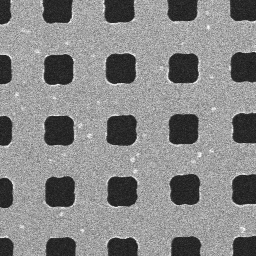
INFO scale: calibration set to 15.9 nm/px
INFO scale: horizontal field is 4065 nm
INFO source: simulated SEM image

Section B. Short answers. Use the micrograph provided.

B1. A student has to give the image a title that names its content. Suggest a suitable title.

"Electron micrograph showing a regular array of holes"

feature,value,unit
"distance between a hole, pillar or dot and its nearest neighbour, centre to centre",970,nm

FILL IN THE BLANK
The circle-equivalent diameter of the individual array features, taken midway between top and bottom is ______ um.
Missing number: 0.516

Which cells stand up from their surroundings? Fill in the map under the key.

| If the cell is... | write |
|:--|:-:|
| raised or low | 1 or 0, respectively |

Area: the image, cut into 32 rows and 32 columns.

01111000011110000111100001111000
01111000011110000111100001111000
01111100011110001111100011111000
11111111111111111111111111111111
11111111111111111111111111111111
11111111111111111111111111111111
11111111111111111111111111111111
01111100011110000111100001111000
01111100011110000111100001111000
00111000011110000111100001111000
11111100111111111111111111111111
11111111111111111111111111111111
11111111111111111111111111111111
11111111111111111111111111111111
11111110111111000111110011111000
01111100011110000111100001111000
01111100011110000111100001111000
01111100011110000111100001111000
11111111111111111111111111111111
11111111111111111111111111111111
11111111111111111111111111111111
11111111111111111111111111111111
01111100011111000111100001111000
00111100011110000111100001111000
00111100011110000111100001111000
01111100011111000111110011111100
11111111111111111111111111111111
11111111111111111111111111111111
11111111111111111111111111111111
11111111111111111111111111111110
00111100011110000111100001111000
00111100001110000111100001111000